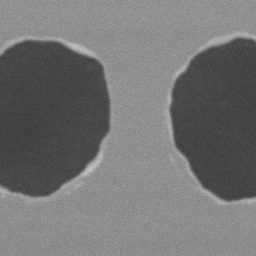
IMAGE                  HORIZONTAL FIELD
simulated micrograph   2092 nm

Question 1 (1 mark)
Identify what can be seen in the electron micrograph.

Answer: holes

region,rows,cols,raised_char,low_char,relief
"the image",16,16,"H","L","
HHHHHHHHHHHHHHHH
HHHHHHHHHHHHHHHH
HLLHHHHHHHHHHHLL
LLLLLLHHHHHHLLLL
LLLLLLLHHHHLLLLL
LLLLLLLHHHHLLLLL
LLLLLLLHHHHLLLLL
LLLLLLLHHHHLLLLL
LLLLLLLHHHHLLLLL
LLLLLLHHHHHLLLLL
LLLLLHHHHHHHLLLL
LLLLHHHHHHHHHLLL
HHHHHHHHHHHHHHLH
HHHHHHHHHHHHHHHH
HHHHHHHHHHHHHHHH
HHHHHHHHHHHHHHHH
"